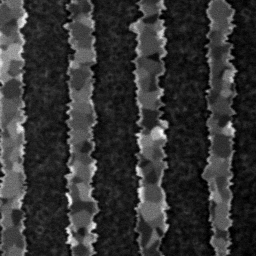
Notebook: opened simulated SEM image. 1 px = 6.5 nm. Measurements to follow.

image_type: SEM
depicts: one or a few lines or trenches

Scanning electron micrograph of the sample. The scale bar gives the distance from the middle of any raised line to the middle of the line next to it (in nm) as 451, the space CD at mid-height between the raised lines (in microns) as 0.298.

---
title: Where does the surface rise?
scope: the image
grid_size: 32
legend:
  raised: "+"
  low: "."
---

+++......++......+++......++....
+++......++.......++......+++...
+++......++......+++......+++...
+++.....++++....++++......+++...
+++......+++.....+++......++....
+++......+++.....++++.....+++...
+++......+++.....++++.....+++...
+++......+++.....+++......+++...
+++......++......++++.....+++...
+++......+++.....+++......+++...
+++......+++.....+++......+++...
+++......+++.....+++......+++...
+++......++......+++......+++...
+++......+++.....+++......+++...
+++......+++.....+++......+++...
+++.....++++.....++++.....+++...
+++......++.......++......+++...
+++......+++.....++++.....+++...
+++......+++......++......+++...
+++......++......++++.....+++...
+++.....++++.....++++.....+++...
+++......+++.....+++.....++++...
+++.....+++.......++......+++...
+++.....+++.......++......+++...
+++.....+++......++++.....+++...
+++......+++.....++++.....+++...
+++......+++.....++++.....+++...
+++......+++.....++++.....+++...
+++.....++++.....++++......++...
+++......+++.....+++.......++...
+++......+++.....+++......+++...
+++......+++......++.......+....